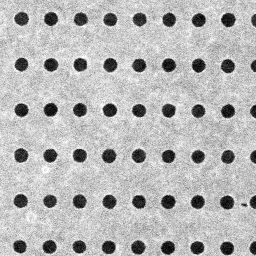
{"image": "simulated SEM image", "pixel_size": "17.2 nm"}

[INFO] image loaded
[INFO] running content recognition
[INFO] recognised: a regular array of holes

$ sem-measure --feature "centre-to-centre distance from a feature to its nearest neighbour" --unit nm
505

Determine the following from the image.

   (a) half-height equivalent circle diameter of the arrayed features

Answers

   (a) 257 nanometres